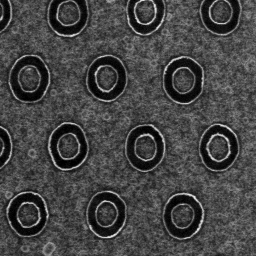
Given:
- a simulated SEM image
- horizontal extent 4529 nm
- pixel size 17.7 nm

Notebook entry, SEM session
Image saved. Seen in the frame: a regular array of ring-shaped raised bodies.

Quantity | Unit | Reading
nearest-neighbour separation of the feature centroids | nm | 1350